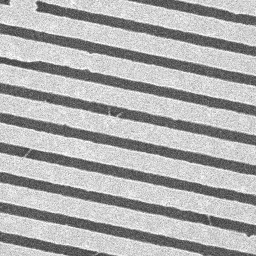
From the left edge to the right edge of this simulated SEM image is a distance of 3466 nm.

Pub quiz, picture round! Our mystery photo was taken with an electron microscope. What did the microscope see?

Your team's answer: parallel lines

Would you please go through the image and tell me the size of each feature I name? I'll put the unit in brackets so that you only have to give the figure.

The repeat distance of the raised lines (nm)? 395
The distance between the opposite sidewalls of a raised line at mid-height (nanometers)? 247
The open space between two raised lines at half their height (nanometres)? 148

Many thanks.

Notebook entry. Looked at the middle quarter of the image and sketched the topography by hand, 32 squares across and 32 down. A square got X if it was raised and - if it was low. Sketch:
-XXXXXXXXXXXXXXXXXXXXXX---------
-------XXXXXXXXXXXXXXXXXXXX-----
----------XXXXXXXXXXXXXXXXXXXXXX
X--------------XXXXXXXXXXXXXXXXX
XXXXXX--------------XXXXXXXXXXXX
XXXXXXXXXXX--------------XXXXXXX
XXXXXXXXXXXXXXX---------------XX
XXXXXXXXXXXXXXXXXXXX------------
---XXXXXXXXXXXXXXXXXXXXXX-------
--------XXXXXXXXXXXXXXXXXXXXXX--
-------------XXXXXXXXXXXXXXXXXXX
XXXX--------------XXXXXXXXXXXXXX
XXXXXXXXX--------------XXXXXXXXX
XXXXXXXXXXXXXX-------------XXXXX
XXXXXXXXXXXXXXXXX---------------
-XXXXXXXXXXXXXXXXXXXXXX---------
------XXXXXXXXXXXXXXXXXXXXXX----
-----------XXXXXXXXXXXXXXXXXXXXX
XX--------------XXXXXXXXXXXXXXXX
XXXXXXX-------------XXXXXXXXXXXX
XXXXXXXXXXXX--------------XXXXXX
XXXXXXXXXXXXXXXX--------------XX
XXXXXXXXXXXXXXXXXXXXX-----------
----XXXXXXXXXXXXXXXXXXXXXX------
---------XXXXXXXXXXXXXXXXXXXXXX-
-------------XXXXXXXXXXXXXXXXXXX
XXXX--------------XXXXXXXXXXXXXX
XXXXXXXXX--------------XXXXXXXXX
XXXXXXXXXXXXXX--------------XXXX
XXXXXXXXXXXXXXXXXXX-------------
--XXXXXXXXXXXXXXXXXXXXXX--------
------XXXXXXXXXXXXXXXXXXXXXX----